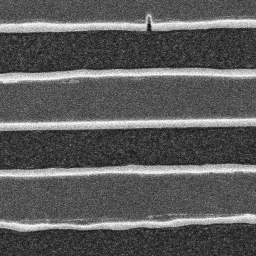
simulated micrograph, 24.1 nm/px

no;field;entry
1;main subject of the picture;one or a few lines or trenches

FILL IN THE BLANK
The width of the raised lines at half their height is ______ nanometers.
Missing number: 1270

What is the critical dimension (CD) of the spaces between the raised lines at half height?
1080 nm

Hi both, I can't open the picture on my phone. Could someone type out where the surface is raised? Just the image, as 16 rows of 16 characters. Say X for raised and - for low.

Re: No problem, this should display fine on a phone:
XXXXXXXXXXXXXXXX
XXXXXXXXXXXXXXXX
----------------
----------------
---------XXXX---
XXXXXXXXXXXXXXXX
XXXXXXXXXXXXXXXX
XXXXXXXXXXXXXXXX
----------------
----------------
-------------XX-
XXXXXXXXXXXXXXXX
XXXXXXXXXXXXXXXX
XXXXXXXXXXXXXXXX
----------------
----------------